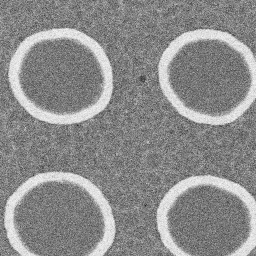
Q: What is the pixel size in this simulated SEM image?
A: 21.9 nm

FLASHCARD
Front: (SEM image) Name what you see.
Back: raised bodies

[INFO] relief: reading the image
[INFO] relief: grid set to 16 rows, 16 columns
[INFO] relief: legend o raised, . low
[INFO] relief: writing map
................
................
..ooo......ooo..
.ooooo....oooooo
.oooooo...oooooo
.oooooo...oooooo
..oooo.....oooo.
.............o..
................
................
................
..ooo.......oo..
.ooooo.....ooooo
.oooooo...oooooo
.oooooo...oooooo
.ooooo.....oooo.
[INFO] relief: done